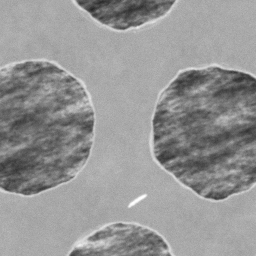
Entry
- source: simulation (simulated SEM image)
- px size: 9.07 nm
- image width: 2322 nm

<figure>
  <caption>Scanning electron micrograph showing holes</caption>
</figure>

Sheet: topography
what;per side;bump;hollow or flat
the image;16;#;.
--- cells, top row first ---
#####......#####
######...#######
################
################
....########...#
.....#####......
......####......
......####......
......####......
......####......
.....#####......
....#######.....
################
################
######....######
#####......#####